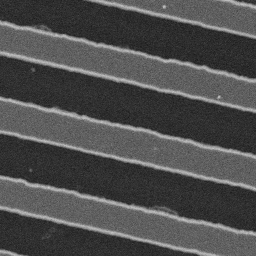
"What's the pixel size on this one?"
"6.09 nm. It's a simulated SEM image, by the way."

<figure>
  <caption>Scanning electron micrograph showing lines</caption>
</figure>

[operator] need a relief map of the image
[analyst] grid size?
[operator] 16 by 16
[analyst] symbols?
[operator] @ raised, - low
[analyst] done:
--------@@@@@@@@
@-----------@@@@
@@@@@-----------
@@@@@@@@@-------
-----@@@@@@@@@--
---------@@@@@@@
@@------------@@
@@@@@@----------
-@@@@@@@@@------
-----@@@@@@@@@@-
----------@@@@@@
@@------------@@
@@@@@@@---------
--@@@@@@@@@-----
------@@@@@@@@@@
-----------@@@@@